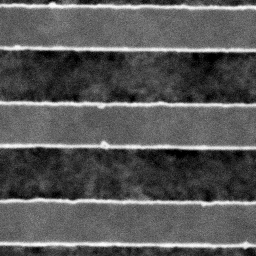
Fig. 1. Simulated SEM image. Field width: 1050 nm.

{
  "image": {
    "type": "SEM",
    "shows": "lines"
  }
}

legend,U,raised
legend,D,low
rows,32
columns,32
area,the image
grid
DDDDDDUDDDDDDDDDDDDDDDDDDDDDDDDD
UUUUUUUUUUUUUUUUUUUUUUUUUUUUUUUU
UUUUUUUUUUUUUUUUUUUUUUUUUUUUUUUU
UUUUUUUUUUUUUUUUUUUUUUUUUUUUUUUU
UUUUUUUUUUUUUUUUUUUUUUUUUUUUUUUU
UUUUUUUUUUUUUUUUUUUUUUUUUUUUUUUU
DDDDDDDDDDDDDDDDDDDDDDDDDDDDDDDD
DDDDDDDDDDDDDDDDDDDDDDDDDDDDDDDD
DDDDDDDDDDDDDDDDDDDDDDDDDDDDDDDD
DDDDDDDDDDDDDDDDDDDDDDDDDDDDDDDD
DDDDDDDDDDDDDDDDDDDDDDDDDDDDDDDD
DDDDDDDDDDDDDDDDDDDDDDDDDDDDDDDD
DDDDDDDDDDDDDDDDDDDDDDDDDDDDDDDD
UUUUUUUUUUUUUUUUUUUUUUUUUUUUUUUU
UUUUUUUUUUUUUUUUUUUUUUUUUUUUUUUU
UUUUUUUUUUUUUUUUUUUUUUUUUUUUUUUU
UUUUUUUUUUUUUUUUUUUUUUUUUUUUUUUU
UUUUUUUUUUUUUUUUUUUUUUUUUUUUUUUU
DDDDDDDDDDDDDDDDDDDDDDUUUUUUUUUU
DDDDDDDDDDDDDDDDDDDDDDDDDDDDDDDD
DDDDDDDDDDDDDDDDDDDDDDDDDDDDDDDD
DDDDDDDDDDDDDDDDDDDDDDDDDDDDDDDD
DDDDDDDDDDDDDDDDDDDDDDDDDDDDDDDD
DDDDDDDDDDDDDDDDDDDDDDDDDDDDDDDD
DDDDDDDDDDDDDDDDDDDDDDDDDDDDDDDD
UUUUUUUUUUUUUUUUUUUUUUUUUUUUUUUU
UUUUUUUUUUUUUUUUUUUUUUUUUUUUUUUU
UUUUUUUUUUUUUUUUUUUUUUUUUUUUUUUU
UUUUUUUUUUUUUUUUUUUUUUUUUUUUUUUU
UUUUUUUUUUUUUUUUUUUUUUUUUUUUUUUU
UUUUUUUUUUUUUUUUUUUUUUUUUUUUUUUU
DDDDDDDDDDDDDDDDDDDDDDDDDDDDDDDD